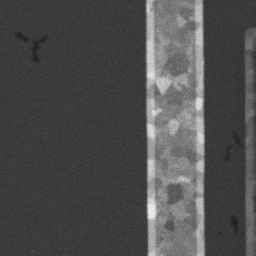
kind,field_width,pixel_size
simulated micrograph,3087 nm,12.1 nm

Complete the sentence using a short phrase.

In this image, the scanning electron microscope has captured wiring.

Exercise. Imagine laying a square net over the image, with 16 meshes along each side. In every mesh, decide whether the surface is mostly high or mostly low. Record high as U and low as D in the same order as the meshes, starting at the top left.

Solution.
DDDDDDDDDUUUDDDD
DDDDDDDDDUUUDDDD
DDDDDDDDDUUUDDDD
DDDDDDDDDUUUDDDD
DDDDDDDDDUUUDDDD
DDDDDDDDDUUUDDDD
DDDDDDDDDUUUDDDD
DDDDDDDDDUUUDDDD
DDDDDDDDDUUUDDDD
DDDDDDDDDUUUDDDD
DDDDDDDDDUUUDDDD
DDDDDDDDDUUUDDDD
DDDDDDDDDUUUDDDD
DDDDDDDDDUUUDDDD
DDDDDDDDDDUUDDDD
DDDDDDDDDDUUUDDD